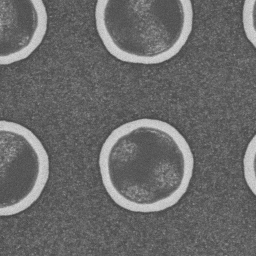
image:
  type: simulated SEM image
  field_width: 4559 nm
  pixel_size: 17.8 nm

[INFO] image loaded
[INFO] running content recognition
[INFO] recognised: raised bodies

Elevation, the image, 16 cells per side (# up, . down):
##....######....
###...######....
##.....####.....
#.......##......
................
................
................
................
##.....####.....
###....#####....
###....#####....
##.....#####....
##......###.....
................
................
................